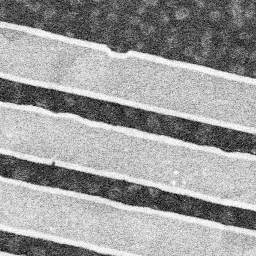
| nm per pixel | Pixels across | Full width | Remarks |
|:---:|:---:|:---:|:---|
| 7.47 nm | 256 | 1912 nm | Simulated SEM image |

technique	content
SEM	one or a few lines or trenches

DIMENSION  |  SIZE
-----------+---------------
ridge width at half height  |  353 nm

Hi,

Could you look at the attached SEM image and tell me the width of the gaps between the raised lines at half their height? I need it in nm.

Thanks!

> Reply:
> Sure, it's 209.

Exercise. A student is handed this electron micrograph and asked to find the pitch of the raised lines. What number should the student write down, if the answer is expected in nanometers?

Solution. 560